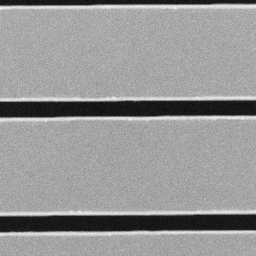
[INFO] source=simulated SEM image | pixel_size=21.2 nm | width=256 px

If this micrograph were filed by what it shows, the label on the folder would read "lines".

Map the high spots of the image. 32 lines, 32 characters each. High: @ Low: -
--------------------------------
@@@@@@@@@@@@@@@@@@@@@@@@@@@@@@@@
@@@@@@@@@@@@@@@@@@@@@@@@@@@@@@@@
@@@@@@@@@@@@@@@@@@@@@@@@@@@@@@@@
@@@@@@@@@@@@@@@@@@@@@@@@@@@@@@@@
@@@@@@@@@@@@@@@@@@@@@@@@@@@@@@@@
@@@@@@@@@@@@@@@@@@@@@@@@@@@@@@@@
@@@@@@@@@@@@@@@@@@@@@@@@@@@@@@@@
@@@@@@@@@@@@@@@@@@@@@@@@@@@@@@@@
@@@@@@@@@@@@@@@@@@@@@@@@@@@@@@@@
@@@@@@@@@@@@@@@@@@@@@@@@@@@@@@@@
@@@@@@@@@@@@@@@@@@@@@@@@@@@@@@@@
@@@@@@@@@@@@@@@@@@@@@@@@@@@@@@@@
--------------------------------
--------------------------------
@@@@@@@@@@@@@@@@@@@@@@@@@@@@@@@@
@@@@@@@@@@@@@@@@@@@@@@@@@@@@@@@@
@@@@@@@@@@@@@@@@@@@@@@@@@@@@@@@@
@@@@@@@@@@@@@@@@@@@@@@@@@@@@@@@@
@@@@@@@@@@@@@@@@@@@@@@@@@@@@@@@@
@@@@@@@@@@@@@@@@@@@@@@@@@@@@@@@@
@@@@@@@@@@@@@@@@@@@@@@@@@@@@@@@@
@@@@@@@@@@@@@@@@@@@@@@@@@@@@@@@@
@@@@@@@@@@@@@@@@@@@@@@@@@@@@@@@@
@@@@@@@@@@@@@@@@@@@@@@@@@@@@@@@@
@@@@@@@@@@@@@@@@@@@@@@@@@@@@@@@@
@@@@@@@@@@@@@@@@@@@@@@@@@@@@@@@@
--------------------------------
--------------------------------
@@@@@@@@@@@@@@@@@@@@@@@@@@@@@@@@
@@@@@@@@@@@@@@@@@@@@@@@@@@@@@@@@
@@@@@@@@@@@@@@@@@@@@@@@@@@@@@@@@